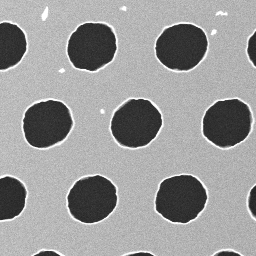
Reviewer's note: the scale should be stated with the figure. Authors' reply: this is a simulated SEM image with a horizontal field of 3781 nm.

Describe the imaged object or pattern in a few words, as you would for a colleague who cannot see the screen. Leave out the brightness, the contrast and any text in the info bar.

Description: holes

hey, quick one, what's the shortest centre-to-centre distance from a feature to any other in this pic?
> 1300 nanometres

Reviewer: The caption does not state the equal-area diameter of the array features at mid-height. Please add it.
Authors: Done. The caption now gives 721 nm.